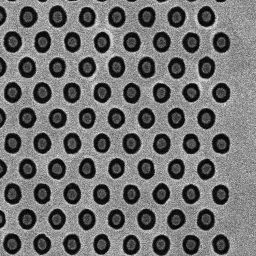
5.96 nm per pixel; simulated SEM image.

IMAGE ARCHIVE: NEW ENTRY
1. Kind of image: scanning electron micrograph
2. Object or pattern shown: a regular array of ring-shaped grooves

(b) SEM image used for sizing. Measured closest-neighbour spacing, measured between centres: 28.7 px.